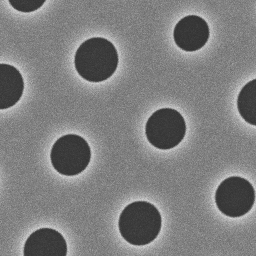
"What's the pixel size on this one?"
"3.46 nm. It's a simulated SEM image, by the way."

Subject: holes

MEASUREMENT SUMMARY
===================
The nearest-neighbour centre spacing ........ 337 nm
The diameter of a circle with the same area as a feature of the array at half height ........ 0.142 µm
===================